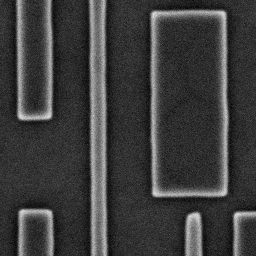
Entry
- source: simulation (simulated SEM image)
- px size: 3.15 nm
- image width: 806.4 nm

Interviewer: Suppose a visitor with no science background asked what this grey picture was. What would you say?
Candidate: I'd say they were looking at wiring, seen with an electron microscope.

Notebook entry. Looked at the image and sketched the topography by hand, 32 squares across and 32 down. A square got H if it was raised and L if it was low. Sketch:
LLHHHHLLLLLHHLLLLLLLLLLLLLLLLLLL
LLHHHHLLLLLHHLLLLLLLLHHHHHHHLLLL
LLHHHHLLLLLHHLLLLLLHHHHHHHHHLLLL
LLHHHHLLLLLHHLLLLLLHHHHHHHHHLLLL
LLHHHHLLLLLHHLLLLLLHHHHHHHHHLLLL
LLHHHHLLLLLHHLLLLLLHHHHHHHHHLLLL
LLHHHHLLLLLHHLLLLLLHHHHHHHHHLLLL
LLHHHHLLLLLHHLLLLLLHHHHHHHHHLLLL
LLHHHHLLLLLHHLLLLLLHHHHHHHHHLLLL
LLHHHHLLLLLHHLLLLLLHHHHHHHHHLLLL
LLHHHHHLLLLHHLLLLLLHHHHHHHHHLLLL
LLHHHHLLLLLHHLLLLLLHHHHHHHHHLLLL
LLHHHHLLLLLHHLLLLLLHHHHHHHHHLLLL
LLHHHHLLLLLHHLLLLLLHHHHHHHHHLLLL
LLHHHHLLLLLHHLLLLLLHHHHHHHHHLLLL
LLLLLLLLLLLHHLLLLLLHHHHHHHHHLLLL
LLLLLLLLLLLHHLLLLLLHHHHHHHHHLLLL
LLLLLLLLLLLHHLLLLLLHHHHHHHHHLLLL
LLLLLLLLLLLHHLLLLLLHHHHHHHHHLLLL
LLLLLLLLLLLHHLLLLLLHHHHHHHHHLLLL
LLLLLLLLLLLHHLLLLLLHHHHHHHHHLLLL
LLLLLLLLLLLHHLLLLLLHHHHHHHHHLLLL
LLLLLLLLLLLHHLLLLLLHHHHHHHHHLLLL
LLLLLLLLLLLHHLLLLLLHHHHHHHHHLLLL
LLLLLLLLLLLHHLLLLLLHHHHLLHHLLLLL
LLLLLLLLLLLHHLLLLLLLLLLLLLLLLLLL
LLLHHHLLLLLHHLLLLLLLLLLLLLLLLLLL
LLHHHHHLLLLHHLLLLLLLLLLHHLLLLHHH
LLHHHHHLLLLHHLLLLLLLLLLHHLLLLHHH
LLHHHHHLLLLHHLLLLLLLLLLHHLLLLHHH
LLHHHHHLLLLLHLLLLLLLLLLHHLLLLHHH
LLHHHHHLLLLLHLLLLLLLLLLHHLLLLHHH